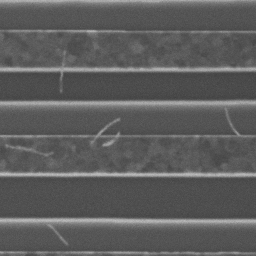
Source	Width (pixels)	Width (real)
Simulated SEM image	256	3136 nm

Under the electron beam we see lines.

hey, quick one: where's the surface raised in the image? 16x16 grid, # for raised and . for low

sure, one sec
################
################
################
################
................
................
........########
################
################
################
################
................
................
................
################
################